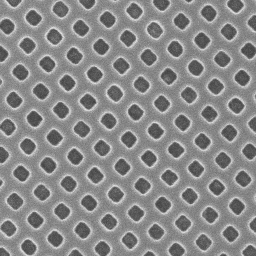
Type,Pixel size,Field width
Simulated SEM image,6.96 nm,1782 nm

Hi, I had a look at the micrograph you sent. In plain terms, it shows a regular array of holes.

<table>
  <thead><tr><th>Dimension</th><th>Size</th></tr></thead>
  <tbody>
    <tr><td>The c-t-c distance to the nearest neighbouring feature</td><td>0.192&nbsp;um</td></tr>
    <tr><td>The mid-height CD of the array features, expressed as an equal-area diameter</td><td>0.111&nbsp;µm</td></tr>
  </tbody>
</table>